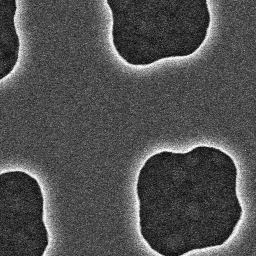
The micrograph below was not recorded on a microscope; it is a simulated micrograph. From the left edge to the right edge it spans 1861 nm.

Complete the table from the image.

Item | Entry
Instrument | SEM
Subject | holes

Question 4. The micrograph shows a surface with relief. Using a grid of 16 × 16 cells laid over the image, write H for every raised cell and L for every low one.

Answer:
LHHHHHHLLLLLLHHH
LHHHHHHLLLLLLHHH
LHHHHHHLLLLLLHHH
LHHHHHHHLLLLHHHH
LHHHHHHHHHHHHHHH
HHHHHHHHHHHHHHHH
HHHHHHHHHHHHHHHH
HHHHHHHHHHHHHHHH
HHHHHHHHHHHHHHHH
HHHHHHHHHHLHLLHH
HHHHHHHHHLLLLLLH
LLHHHHHHHLLLLLLH
LLLHHHHHHLLLLLLH
LLLHHHHHHLLLLLLH
LLLHHHHHHLLLLLLH
LLLHHHHHHLLLLHHH